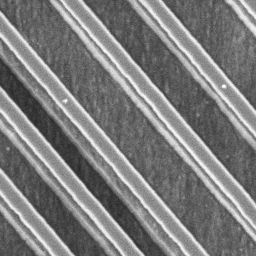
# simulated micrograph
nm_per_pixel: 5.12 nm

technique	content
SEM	lines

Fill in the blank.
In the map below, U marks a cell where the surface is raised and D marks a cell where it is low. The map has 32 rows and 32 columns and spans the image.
DDDDDDDUUUUDDDDDDUUUUDDDDDDDDUUU
DDDDDDDDUUUDDDDDDDUUUDDDDDDDDDUU
UDDDDDDDDUUUDDDDDDDUUUDDDDDDDDDU
UUDDDDDDDDUUUDDDDDDDUUUDDDDDDDDD
UUUDDDDDDDDUUUDDDDDDUUUUDDDDDDDD
UUUDDDDDDDDUUUUDDDDDDUUUUDDDDDDD
UUUUDDDDDDDDUUUUDDDDDDUUUUDDDDDD
DUUUUDDDDDDDDUUUUDDDDDDUUUDDDDDD
DDUUUUDDDDDDDDUUUDDDDDDDUUUDDDDD
DDUUUUUDDDDDDDDUUUDDDDDDDUUUDDDD
DDDUUUUUDDDDDDDDUUUDDDDDDDUUUDDD
UDDDUUUUUDDDDDDDUUUUDDDDDDUUUUDD
UDDDDUUUUDDDDDDDDUUUUDDDDDDUUUUD
UUDDDDUUUUDDDDDDDDUUUUDDDDDDUUUU
UUUDDDDUUUUDDDDDDDDUUUUDDDDDDUUU
UUUUDDDDUUUUDDDDDDDDUUUDDDDDDDUU
DUUUUDDDUUUUUDDDDDDDDUUUDDDDDDDU
DDUUUUDDDUUUUUDDDDDDDDUUUDDDDDDU
DDDUUUUDDDUUUUUDDDDDDDUUUUDDDDDD
DDDDUUUDDDDUUUUDDDDDDDDUUUUDDDDD
DDDDUUUUDDDDUUUUDDDDDDDDUUUUDDDD
DDDDDUUUUDDDDUUUUDDDDDDDDUUUUDDD
UDDDDDUUUUDDDDUUUUDDDDDDDDUUUDDD
UUDDDDDUUUUDDDUUUUUDDDDDDDDUUUDD
UUUDDDDDUUUUDDDUUUUUDDDDDDDUUUUD
UUUUDDDDDUUUUDDDUUUUUDDDDDDDUUUU
DUUUUDDDDDUUUDDDDUUUUDDDDDDDDUUU
DUUUUUDDDDUUUUDDDDUUUUDDDDDDDDUU
DDUUUUDDDDDUUUUDDDDUUUUDDDDDDDDU
DDDUUUUDDDDDUUUUDDDUUUUUDDDDDDDD
DDDDUUUUDDDDDUUUUDDDUUUUUDDDDDDD
DDDDDUUUUDDDDDUUUUDDDUUUUUDDDDDD